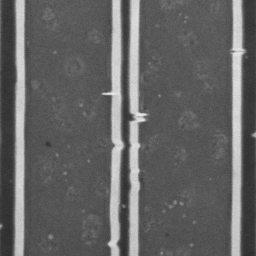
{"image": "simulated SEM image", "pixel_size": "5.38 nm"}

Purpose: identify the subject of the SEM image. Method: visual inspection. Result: one or a few lines or trenches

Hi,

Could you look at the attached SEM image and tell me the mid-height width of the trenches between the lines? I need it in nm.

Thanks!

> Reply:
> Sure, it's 521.